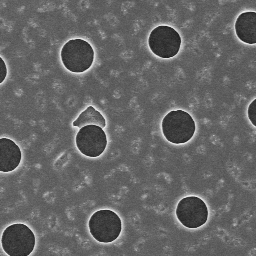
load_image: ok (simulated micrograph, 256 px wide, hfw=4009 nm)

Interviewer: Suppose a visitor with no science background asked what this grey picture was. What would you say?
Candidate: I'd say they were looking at holes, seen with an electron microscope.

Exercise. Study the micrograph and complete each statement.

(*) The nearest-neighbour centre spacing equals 1350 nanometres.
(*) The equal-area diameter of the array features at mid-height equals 523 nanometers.